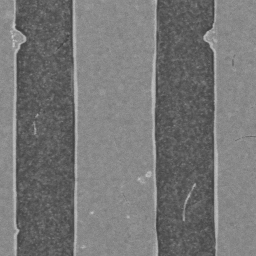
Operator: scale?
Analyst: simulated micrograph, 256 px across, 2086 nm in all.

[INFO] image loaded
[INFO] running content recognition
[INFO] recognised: one or a few lines or trenches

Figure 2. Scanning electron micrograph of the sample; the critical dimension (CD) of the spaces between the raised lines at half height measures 488 nanometers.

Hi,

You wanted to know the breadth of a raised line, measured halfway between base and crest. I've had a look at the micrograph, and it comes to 0.653 micrometres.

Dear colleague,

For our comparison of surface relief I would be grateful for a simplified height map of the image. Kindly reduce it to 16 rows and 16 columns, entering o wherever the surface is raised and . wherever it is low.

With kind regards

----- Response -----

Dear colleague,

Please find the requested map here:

o....ooooo...ooo
o....ooooo...ooo
o....ooooo...ooo
o....ooooo...ooo
o....ooooo...ooo
o....ooooo...ooo
o....ooooo...ooo
o....ooooo...ooo
o....ooooo...ooo
o....ooooo...ooo
o....ooooo...ooo
o....ooooo...ooo
o....ooooo...ooo
o....ooooo...ooo
o....ooooo....oo
o....ooooo....oo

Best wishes